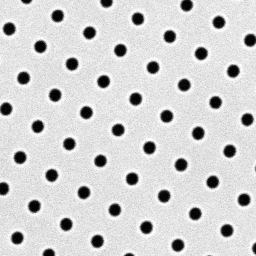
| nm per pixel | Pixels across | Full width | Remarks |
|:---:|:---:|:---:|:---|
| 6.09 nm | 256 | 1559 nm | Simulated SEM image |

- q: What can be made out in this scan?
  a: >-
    a regular array of holes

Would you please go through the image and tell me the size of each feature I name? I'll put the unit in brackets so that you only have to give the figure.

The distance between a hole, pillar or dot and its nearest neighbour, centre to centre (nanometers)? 216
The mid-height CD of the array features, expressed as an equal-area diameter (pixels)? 13.6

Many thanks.